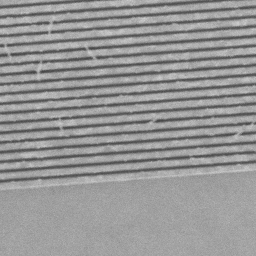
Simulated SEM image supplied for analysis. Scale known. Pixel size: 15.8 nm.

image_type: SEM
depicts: parallel lines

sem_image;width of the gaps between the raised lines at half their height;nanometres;55.2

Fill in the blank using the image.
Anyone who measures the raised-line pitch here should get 152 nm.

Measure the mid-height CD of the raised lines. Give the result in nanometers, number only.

96.5